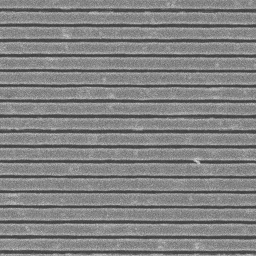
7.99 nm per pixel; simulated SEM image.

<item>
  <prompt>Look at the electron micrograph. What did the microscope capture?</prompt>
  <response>parallel lines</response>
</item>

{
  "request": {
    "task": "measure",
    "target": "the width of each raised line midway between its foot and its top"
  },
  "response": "95.9 nm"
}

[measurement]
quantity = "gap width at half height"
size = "3 pixels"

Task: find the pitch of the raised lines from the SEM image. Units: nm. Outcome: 121